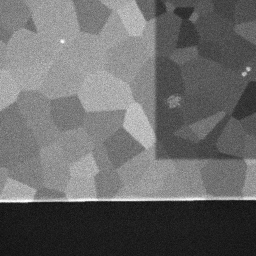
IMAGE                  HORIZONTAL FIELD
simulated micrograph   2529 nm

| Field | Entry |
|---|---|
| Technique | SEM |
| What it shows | wiring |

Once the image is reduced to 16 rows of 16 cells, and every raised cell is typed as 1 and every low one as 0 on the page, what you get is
1111111111111111
1111111111111111
1111111111111111
1111111111111111
1111111111111111
1111111111111111
1111111111111111
1111111111111111
1111111111111111
1111111111111111
1111111111111111
1111111111111111
1111111111111000
0000000000000000
0000000000000000
0000000000000000